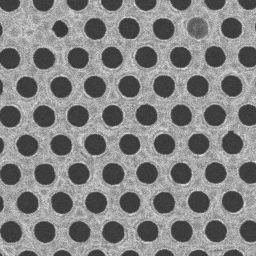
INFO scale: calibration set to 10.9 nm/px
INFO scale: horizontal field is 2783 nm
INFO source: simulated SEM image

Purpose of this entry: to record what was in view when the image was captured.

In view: a regular array of holes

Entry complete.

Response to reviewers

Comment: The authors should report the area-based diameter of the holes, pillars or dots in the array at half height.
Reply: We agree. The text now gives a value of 238 nm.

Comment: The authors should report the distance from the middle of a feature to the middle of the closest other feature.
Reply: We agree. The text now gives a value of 362 nm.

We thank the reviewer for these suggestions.